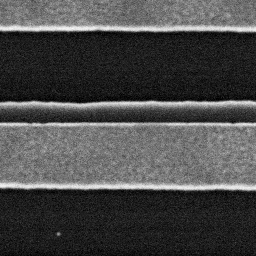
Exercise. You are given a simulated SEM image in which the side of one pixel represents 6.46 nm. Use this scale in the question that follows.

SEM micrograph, lines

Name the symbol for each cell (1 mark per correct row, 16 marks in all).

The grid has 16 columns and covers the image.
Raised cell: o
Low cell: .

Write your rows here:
oooooooooooooooo
oooooooooooooooo
................
................
................
................
oooo.ooooooooooo
oooooooooooooooo
oooooooooooooooo
oooooooooooooooo
oooooooooooooooo
oooooooooooooooo
................
................
................
................